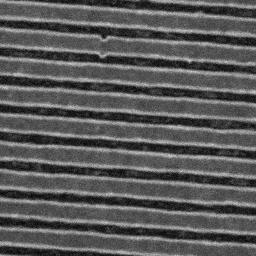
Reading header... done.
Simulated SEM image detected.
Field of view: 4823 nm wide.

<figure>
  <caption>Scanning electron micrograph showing parallel lines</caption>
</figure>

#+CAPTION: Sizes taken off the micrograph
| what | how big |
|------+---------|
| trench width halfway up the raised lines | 12.2 pixels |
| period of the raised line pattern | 532 nanometers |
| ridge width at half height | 312 nm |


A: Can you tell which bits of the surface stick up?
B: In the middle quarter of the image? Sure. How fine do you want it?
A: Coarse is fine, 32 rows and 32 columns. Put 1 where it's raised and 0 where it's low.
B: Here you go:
11111111110010000000000000000000
11111111111111111111111100000000
11111111111111111111111111111111
11111111111111111111111111111111
00000000000001111111111111111111
00000000000000000000000000011111
00000000000000000000000000000000
11111111111110000000000000000000
11111111111111111111111000000000
11111111111111111111111111111111
11111111111111111111111111111111
00000000001001111111111111111111
00000000000000000000000010111111
00000000000000000000000000000000
11111111100000000000000000000000
11111111111111111111111000000000
11111111111111111111111111111111
11111111111111111111111111111111
00000000000111111111111111111111
00000000000000000000000100111111
00000000000000000000000000000000
11111111111100000000000000000000
11111111111111111111110000000000
11111111111111111111111111111111
11111111111111111111111111111111
00000010011111111111111111111111
00000000000000000000000110111111
00000000000000000000000000000000
11111111011000000000000000000000
11111111111111111111110000000000
11111111111111111111111111111111
11111111111111111111111111111111